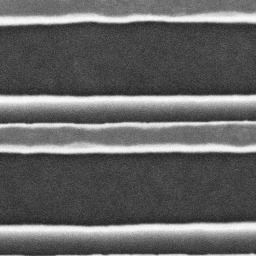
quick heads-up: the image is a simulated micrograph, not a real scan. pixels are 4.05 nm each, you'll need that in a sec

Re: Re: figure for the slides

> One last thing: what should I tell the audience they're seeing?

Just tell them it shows lines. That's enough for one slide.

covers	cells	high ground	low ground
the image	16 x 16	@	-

@@@@@@@@@@@@@@@@
----------------
----------------
----------------
----------------
----------------
@@@@@@@@@@@@@@@@
@@@@@@@@@@@@@@@@
@@@@@@@@@@@@@@@@
----------------
----------------
----------------
----------------
----------------
@@@@@@@@@@@@@@@@
@@@@@@@@@@@@@@@@